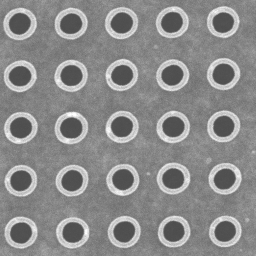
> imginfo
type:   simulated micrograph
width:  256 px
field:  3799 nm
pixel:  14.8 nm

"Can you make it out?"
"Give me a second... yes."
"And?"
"a regular array of ring-shaped raised bodies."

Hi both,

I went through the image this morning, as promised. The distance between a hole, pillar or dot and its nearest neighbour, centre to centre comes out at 751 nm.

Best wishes